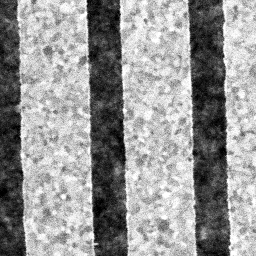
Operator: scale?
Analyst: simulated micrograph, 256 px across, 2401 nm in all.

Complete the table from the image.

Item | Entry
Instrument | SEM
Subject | one or a few lines or trenches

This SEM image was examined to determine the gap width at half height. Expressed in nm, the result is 330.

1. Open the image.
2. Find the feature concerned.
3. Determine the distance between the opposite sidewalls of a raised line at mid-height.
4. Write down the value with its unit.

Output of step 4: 613 nm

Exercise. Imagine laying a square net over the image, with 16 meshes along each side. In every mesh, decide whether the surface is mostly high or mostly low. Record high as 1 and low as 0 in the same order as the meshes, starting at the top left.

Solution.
0111100011110011
0111100011110011
0111100011110011
0111100011110011
0111110011110011
0111110011110011
0111100011110011
0111110011110011
0111110011110011
0111110011110011
0111110011110011
0111110011110011
0011110011110011
0011110011110011
0011110011110011
0011110011110011